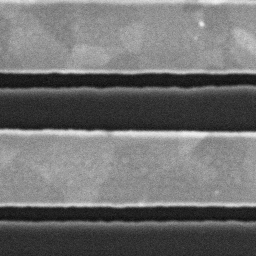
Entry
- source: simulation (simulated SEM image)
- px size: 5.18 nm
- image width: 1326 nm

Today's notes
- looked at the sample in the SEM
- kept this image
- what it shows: lines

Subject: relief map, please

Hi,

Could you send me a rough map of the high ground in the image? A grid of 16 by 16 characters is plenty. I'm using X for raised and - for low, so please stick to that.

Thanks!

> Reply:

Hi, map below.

XXXXXXXXXXXXXXXX
XXXXXXXXXXXXXXXX
XXXXXXXXXXXXXXXX
XXXXXXXXXXXXXXXX
XXXXXXXXXXXXXXXX
----------------
----------------
----------------
XXXXXXXXXXXXXXXX
XXXXXXXXXXXXXXXX
XXXXXXXXXXXXXXXX
XXXXXXXXXXXXXXXX
XXXXXXXXXXXXXXXX
----------------
----------------
----------------